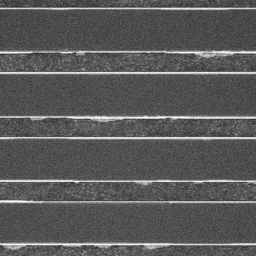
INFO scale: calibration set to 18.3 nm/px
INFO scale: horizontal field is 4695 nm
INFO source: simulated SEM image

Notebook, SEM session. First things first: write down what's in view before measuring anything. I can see lines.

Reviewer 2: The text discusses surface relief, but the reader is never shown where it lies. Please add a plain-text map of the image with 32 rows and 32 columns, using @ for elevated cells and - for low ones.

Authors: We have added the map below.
--------------------------------
@@@@@@@@@@@@@@@@@@@@@@@@@@@@@@@@
@@@@@@@@@@@@@@@@@@@@@@@@@@@@@@@@
@@@@@@@@@@@@@@@@@@@@@@@@@@@@@@@@
@@@@@@@@@@@@@@@@@@@@@@@@@@@@@@@@
@@@@@@@@@@@@@@@@@@@@@@@@@@@@@@@@
@@@@------------------@@@---@@@@
--------------------------------
--------------------------------
@@@@@@@@@@@@@@@@@@@@@@@@@@@@@@@@
@@@@@@@@@@@@@@@@@@@@@@@@@@@@@@@@
@@@@@@@@@@@@@@@@@@@@@@@@@@@@@@@@
@@@@@@@@@@@@@@@@@@@@@@@@@@@@@@@@
@@@@@@@@@@@@@@@@@@@@@@@@@@@@@@@@
@@@@@@@@@@@@@@@@@@@@@@@@@@@@@@@@
--------------------------------
--------------------------------
@@@@@@@@@@@@@@@@@@@@@@@@@@@@@@@@
@@@@@@@@@@@@@@@@@@@@@@@@@@@@@@@@
@@@@@@@@@@@@@@@@@@@@@@@@@@@@@@@@
@@@@@@@@@@@@@@@@@@@@@@@@@@@@@@@@
@@@@@@@@@@@@@@@@@@@@@@@@@@@@@@@@
@@@@@@@@@@@@@@@@@@@@@@@@@@@@@@@@
--------------------------------
--------------------------------
@@@@@@@@@@@@@@@@@@@@@@@@@@@@@@@@
@@@@@@@@@@@@@@@@@@@@@@@@@@@@@@@@
@@@@@@@@@@@@@@@@@@@@@@@@@@@@@@@@
@@@@@@@@@@@@@@@@@@@@@@@@@@@@@@@@
@@@@@@@@@@@@@@@@@@@@@@@@@@@@@@@@
@@@@@@@@@@@@@@@@@@@@@@@@@@@@@@@@
--------------------------------